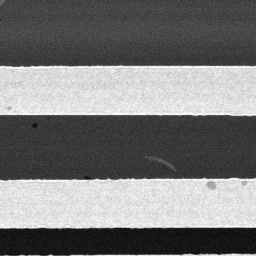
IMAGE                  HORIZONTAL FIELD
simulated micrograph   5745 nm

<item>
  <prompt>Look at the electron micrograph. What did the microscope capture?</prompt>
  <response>lines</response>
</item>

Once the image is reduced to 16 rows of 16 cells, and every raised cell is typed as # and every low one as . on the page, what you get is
................
................
................
................
################
################
################
................
................
................
................
################
################
################
................
................